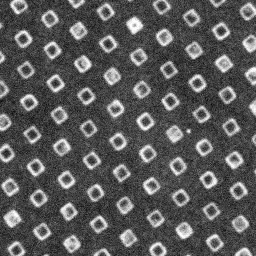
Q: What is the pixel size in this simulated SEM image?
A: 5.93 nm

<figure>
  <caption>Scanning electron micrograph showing a regular array of raised bodies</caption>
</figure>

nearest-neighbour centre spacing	188	nm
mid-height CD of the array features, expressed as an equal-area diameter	84.3	nm